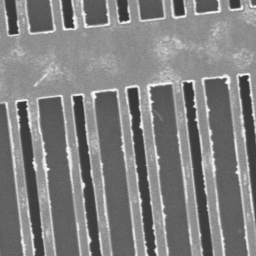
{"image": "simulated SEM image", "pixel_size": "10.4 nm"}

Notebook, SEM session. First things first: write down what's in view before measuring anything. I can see parallel lines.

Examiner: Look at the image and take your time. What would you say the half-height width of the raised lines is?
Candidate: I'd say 122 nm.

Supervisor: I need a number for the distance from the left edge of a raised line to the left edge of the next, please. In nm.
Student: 292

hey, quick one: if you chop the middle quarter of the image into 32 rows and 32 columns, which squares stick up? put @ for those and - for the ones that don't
@@@@@@@@@@@@@@@@@@@@@@@@@@@@@@@@
@@@@@@@@@@@@@@@@@@@@@@@@@@@@@@@@
@@@@@@@@@@@@@@@@@@@@@@@@@@@@@@@@
@@@@@@@@@@@@@@@@@@@@@@@@@@@@@@@@
@@@@@@@@@@@@@@@@@@@@@@@@@@@@@@-@
@@@@@@@@@@@@@@@@@@@@@@@----@@@--
@@@@@@@@@@@@@@@@---@@------@@@--
@@@@@@@@-----@@@---@@@-----@@@--
@@---@@@-----@@@---@@@-----@@@--
@@---@@@-----@@@---@@@-----@@@--
@@---@@@------@@---@@@------@@--
@@---@@@------@@---@@@------@@--
@@@--@@@------@@@--@@@------@@@-
@@@--@@@------@@@--@@@------@@@-
@@@--@@@------@@@--@@@------@@@-
@@@--@@@------@@@--@@@------@@@-
@@@--@@@------@@@---@@------@@@-
@@@---@@------@@@---@@@-----@@@-
@@@---@@------@@@---@@@------@@-
-@@---@@@------@@---@@@------@@-
-@@@--@@@-----@@@---@@@------@@@
-@@@--@@@------@@---@@@------@@@
-@@@--@@@------@@@--@@@------@@@
-@@@---@@------@@@---@@@-----@@@
-@@@---@@------@@@---@@------@@@
-@@@---@@@-----@@@---@@@-----@@@
-@@@---@@@-----@@@---@@@-----@@@
--@@---@@@------@@---@@@------@@
--@@---@@@------@@---@@@------@@
--@@@--@@@------@@@--@@@------@@
--@@@--@@@------@@---@@@------@@
--@@@--@@@------@@@--@@@------@@